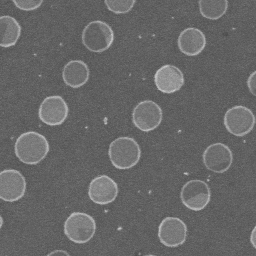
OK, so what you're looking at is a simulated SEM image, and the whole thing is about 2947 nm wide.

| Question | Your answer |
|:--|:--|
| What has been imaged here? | a regular array of raised bodies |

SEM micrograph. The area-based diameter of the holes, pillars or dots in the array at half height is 326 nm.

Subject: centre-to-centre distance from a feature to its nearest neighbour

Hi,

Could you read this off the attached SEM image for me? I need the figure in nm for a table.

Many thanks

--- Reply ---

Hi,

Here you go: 496